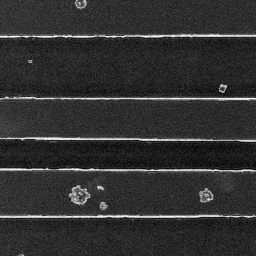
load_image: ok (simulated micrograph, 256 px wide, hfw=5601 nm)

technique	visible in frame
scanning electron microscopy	lines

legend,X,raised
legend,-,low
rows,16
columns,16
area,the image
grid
XXXXXXXXXXXXXXXX
XXXXXXXXXXXXXXXX
----------------
----------------
----------------
----------------
XXXXXXXXXXXXXXXX
XXXXXXXXXXXXXXXX
XXXXXXXXXXXXXXXX
----------------
----------------
XXXXXXXXXXXXXXXX
XXXXXXXXXXXXXXXX
XXXXXXXXXXXXX-XX
----------------
----------------